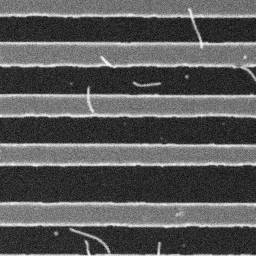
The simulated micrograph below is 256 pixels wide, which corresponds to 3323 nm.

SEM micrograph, lines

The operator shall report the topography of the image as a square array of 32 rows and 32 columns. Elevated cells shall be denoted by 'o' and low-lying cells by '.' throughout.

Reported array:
oooooooooooooooooooooooooooooooo
oooooooooooooooooooooooooooooooo
................................
................................
................................
oooooooooooooooooooooooooooooooo
oooooooooooooooooooooooooooooooo
oooooooooooooooooooooooooooooooo
................................
................................
................................
................................
oooooooooooooooooooooooooooooooo
oooooooooooooooooooooooooooooooo
ooo...o..oo..oo.oo.oooooo....ooo
................................
................................
................................
oooooooooooooooooooooooooooooooo
oooooooooooooooooooooooooooooooo
oooooooooooooooooooooooooooooooo
................................
................................
................................
................................
oooooooooooooooooooooooooooooooo
oooooooooooooooooooooooooooooooo
oooooooooooooooooooooooooooooooo
................................
................................
................................
................................